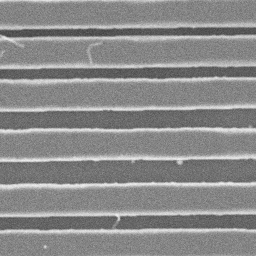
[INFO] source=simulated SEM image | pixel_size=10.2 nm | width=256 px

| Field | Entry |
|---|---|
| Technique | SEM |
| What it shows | lines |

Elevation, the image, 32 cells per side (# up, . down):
################################
################################
################################
#######.....##..................
................................
################################
################################
################################
................................
................................
################################
################################
################################
############################....
................................
................................
################################
################################
################################
################################
................................
................................
................................
################################
################################
################################
################################
................................
................................
################################
################################
################################